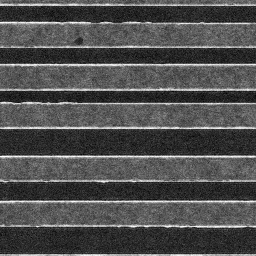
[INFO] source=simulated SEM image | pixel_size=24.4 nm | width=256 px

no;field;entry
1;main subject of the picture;lines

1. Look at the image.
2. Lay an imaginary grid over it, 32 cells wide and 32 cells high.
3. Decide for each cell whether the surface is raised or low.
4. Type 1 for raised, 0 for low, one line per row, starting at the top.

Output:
11111111111111111111111111111111
00000000000000000000000000000000
00000000000000000000000000000000
11111111111111111111111111111111
11111111111111111111111111111111
11111111111111111111111111111111
00000000000000000000000000000000
00000000000000000000000000000000
11111111111111111111111111111111
11111111111111111111111111111111
11111111111111111111111111111111
00000000000000000000000000000000
00000000000000000000000000000000
11111111111111111111111111111111
11111111111111111111111111111111
11111111111111111111111111111111
00000000000000000000000000000000
00000000000000000000000000000000
00000000000000000000000000000000
00000000000000000000000000000000
11111111111111111111111111111111
11111111111111111111111111111111
11111111111111111111111111111111
00000000000000000000000000000000
00000000000000000000000000000000
11111111111111111111111111111111
11111111111111111111111111111111
11111111111111111111111111111111
00000000000000000000000000000000
00000000000000000000000000000000
00000000000000000000000000000000
00000000000000000000000000000000